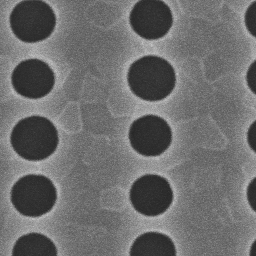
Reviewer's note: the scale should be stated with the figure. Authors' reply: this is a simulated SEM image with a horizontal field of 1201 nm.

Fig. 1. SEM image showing holes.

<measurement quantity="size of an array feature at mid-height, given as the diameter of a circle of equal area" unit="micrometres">0.208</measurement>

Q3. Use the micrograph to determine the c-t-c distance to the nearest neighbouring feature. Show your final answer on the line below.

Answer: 268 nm